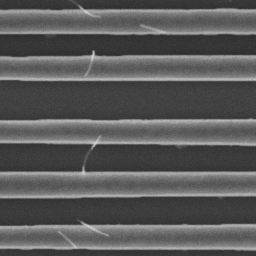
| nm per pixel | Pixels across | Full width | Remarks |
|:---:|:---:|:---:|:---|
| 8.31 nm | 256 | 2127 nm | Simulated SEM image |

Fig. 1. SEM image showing lines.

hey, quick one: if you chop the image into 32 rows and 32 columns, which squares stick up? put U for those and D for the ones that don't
DDDDDDDDDDDDDDDDDDDDDDDDDDDDDDDD
UUUUUUUUUUUUUUUUUUUUUUUUUUUUUUUU
UUUUUUUUUUUUUUUUUUUUUUUUUUUUUUUU
UUUUUUUUUUUUUUUUUUUUUUUUUUUUUUUU
DDDDDDDDDDDDDDDDDDDDDDDDDDDDDDDD
DDDDDDDDDDDDDDDDDDDDDDDDDDDDDDDD
DDDDDDDDDDDDDDDDDDDDDDDDDDDDDDDD
UUUUUUUUUUUUUUUUUUUUUUUUUUUUUUUU
UUUUUUUUUUUUUUUUUUUUUUUUUUUUUUUU
UUUUUUUUUUUUUUUUUUUUUUUUUUUUUUUU
DDDDDDDDDDDDDDDDDDDDDDDDDDDDDDDD
DDDDDDDDDDDDDDDDDDDDDDDDDDDDDDDD
DDDDDDDDDDDDDDDDDDDDDDDDDDDDDDDD
DDDDDDDDDDDDDDDDDDDDDDDDDDDDDDDD
DDDDDDDDDDDDDDDDDDDDDDDDDDDDDDDD
UUUUUUUUUUUUUUUUUUUUUUUUUUUUUUUU
UUUUUUUUUUUUUUUUUUUUUUUUUUUUUUUU
UUUUUUUUUUUUUUUUUUUUUUUUUUUUUUUU
DDDDDDDDDDDDDDDDDDDDDDDDDDDDDDDD
DDDDDDDDDDDDDDDDDDDDDDDDDDDDDDDD
DDDDDDDDDDDDDDDDDDDDDDDDDDDDDDDD
DDDDDDDDDDDDDDDDDDDDDDDDDDDDDDDD
UUUUUUUUUUUUUUUUUUUUUUUUUUUUUUUU
UUUUUUUUUUUUUUUUUUUUUUUUUUUUUUUU
UUUUUUUUUUUUUUUUDDDDDDDDDDDDDDDD
DDDDDDDDDDDDDDDDDDDDDDDDDDDDDDDD
DDDDDDDDDDDDDDDDDDDDDDDDDDDDDDDD
DDDDDDDDDDDDDDDDDDDDDDDDDDDDDDDD
UUUUUUUUUUUUUUUUUUUUUUUUUUUUUUUU
UUUUUUUUUUUUUUUUUUUUUUUUUUUUUUUU
UUUUUUUUUUUUUUUUUUUUUUUUUUUUUUUU
DDDDDDDDDDDDDDDDDDDDDDDDDDDDDDDD